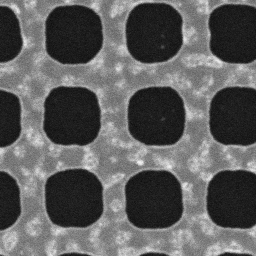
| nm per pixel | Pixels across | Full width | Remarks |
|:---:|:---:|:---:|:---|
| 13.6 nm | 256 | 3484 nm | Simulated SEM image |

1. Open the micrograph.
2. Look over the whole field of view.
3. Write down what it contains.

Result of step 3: holes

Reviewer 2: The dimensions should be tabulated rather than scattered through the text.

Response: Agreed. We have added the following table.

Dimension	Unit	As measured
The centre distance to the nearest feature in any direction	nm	1090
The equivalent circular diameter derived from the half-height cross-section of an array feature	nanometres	845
